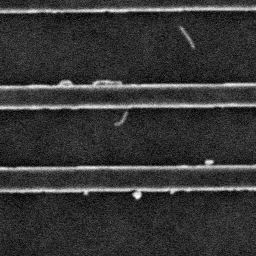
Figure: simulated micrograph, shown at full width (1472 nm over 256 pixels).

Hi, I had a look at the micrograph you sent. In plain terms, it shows lines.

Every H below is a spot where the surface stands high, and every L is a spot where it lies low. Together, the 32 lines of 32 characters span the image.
HHHHHHHHHHHHHHHHHHHHHHHHHHHHHHHH
HHHHHLHLLLLLLLLLLLLLLLLLLLLLLLLL
LLLLLLLLLLLLLLLLLLLLLLLLLLLLLLLL
LLLLLLLLLLLLLLLLLLLLLLLLLLLLLLLL
LLLLLLLLLLLLLLLLLLLLLLLLLLLLLLLL
LLLLLLLLLLLLLLLLLLLLLLLLLLLLLLLL
LLLLLLLLLLLLLLLLLLLLLLLLLLLLLLLL
LLLLLLLLLLLLLLLLLLLLLLLLLLLLLLLL
LLLLLLLLLLLLLLLLLLLLLLLLLLLLLLLL
LLLLLLLLLLLLLLLLLLLLLLLLLLLLLLLL
LLLLLLLLLLLLLLLLLLLLLLLLLLLLHHHH
HHHHHHHHHHHHHHHHHHHHHHHHHHHHHHHH
HHHHHHHHHHHHHHHHHHHHHHHHHHHHHHHH
HHHHHLHHLHLLLLLLLLLLLLLLLLLLLLLL
LLLLLLLLLLLLLLLLLLLLLLLLLLLLLLLL
LLLLLLLLLLLLLLLLLLLLLLLLLLLLLLLL
LLLLLLLLLLLLLLLLLLLLLLLLLLLLLLLL
LLLLLLLLLLLLLLLLLLLLLLLLLLLLLLLL
LLLLLLLLLLLLLLLLLLLLLLLLLLLLLLLL
LLLLLLLLLLLLLLLLLLLLLLLLLLLLLLLL
LLLLLLLLLLLLLLLLLLLLLLLLLLLLLLLL
HHHHHHHHHHHHHHHHHHHHHHHHHHHHHHHH
HHHHHHHHHHHHHHHHHHHHHHHHHHHHHHHH
HHHHHHHHHHHHHHHHHHHHHHHHHHHHHHHH
LLLLLLLLLLLLLLLLLLLLLLLLLLLLLLLL
LLLLLLLLLLLLLLLLLLLLLLLLLLLLLLLL
LLLLLLLLLLLLLLLLLLLLLLLLLLLLLLLL
LLLLLLLLLLLLLLLLLLLLLLLLLLLLLLLL
LLLLLLLLLLLLLLLLLLLLLLLLLLLLLLLL
LLLLLLLLLLLLLLLLLLLLLLLLLLLLLLLL
LLLLLLLLLLLLLLLLLLLLLLLLLLLLLLLL
LLLLLLLLLLLLLLLLLLLLLLLLLLLLLLLL